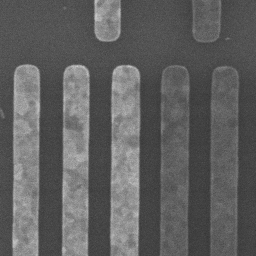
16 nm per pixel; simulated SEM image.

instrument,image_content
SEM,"wiring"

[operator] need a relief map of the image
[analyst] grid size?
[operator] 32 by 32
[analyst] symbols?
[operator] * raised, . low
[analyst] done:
............***.........***.....
............***.........***.....
............***.........***.....
............***.........***.....
............***.........***.....
................................
................................
................................
..***...***....**....**....**...
..***...***...***...****...***..
..***...***...***...****...***..
..***...***...***...****...***..
..***...***...***...****..****..
..***...***...***...****..****..
..***...***...***...****..****..
..***...***...***...****..****..
..***...***...***...****..****..
..***...***...***...***...****..
..***...***...***...***...****..
..***...***...***...***...****..
..***...***...***...***...****..
..***...***...***...***...****..
..***...***...***...***...****..
..***...***...***...***...****..
..***...***...***...***...****..
..***...***...***...***...****..
..***...***...***...***...****..
..***...***...***...***...****..
..***...***...***...***...****..
..***...***...***...***...****..
..***...***...***...***...****..
..***...***...***...***...****..